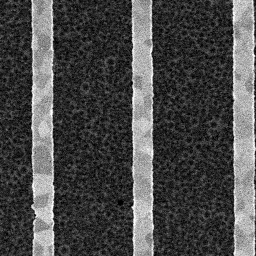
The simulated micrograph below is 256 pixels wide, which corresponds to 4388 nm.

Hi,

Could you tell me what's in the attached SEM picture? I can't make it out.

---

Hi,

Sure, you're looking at one or a few lines or trenches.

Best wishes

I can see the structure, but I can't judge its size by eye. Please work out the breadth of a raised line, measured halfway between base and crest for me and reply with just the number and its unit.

334 nm